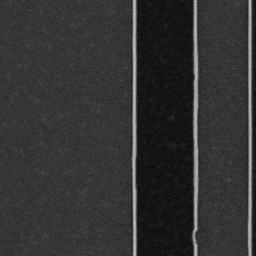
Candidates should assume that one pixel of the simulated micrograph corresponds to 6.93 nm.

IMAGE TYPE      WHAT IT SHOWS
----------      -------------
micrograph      one or a few lines or trenches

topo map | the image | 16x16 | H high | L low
LLLLLLLLHHHHLLLL
LLLLLLLLHHHHLLLL
LLLLLLLLHHHHLLLL
LLLLLLLLHHHHLLLL
LLLLLLLLHHHHLLLL
LLLLLLLLHHHHLLLL
LLLLLLLLHHHHLLLL
LLLLLLLLHHHHLLLL
LLLLLLLLHHHHLLLL
LLLLLLLLHHHHLLLL
LLLLLLLLHHHHLLLL
LLLLLLLLHHHHLLLL
LLLLLLLLHHHHLLLL
LLLLLLLLHHHHLLLL
LLLLLLLLHHHHLLLL
LLLLLLLLHHHHLLLL